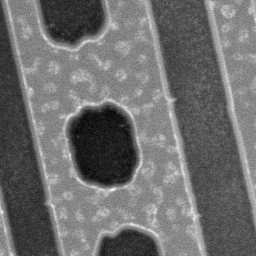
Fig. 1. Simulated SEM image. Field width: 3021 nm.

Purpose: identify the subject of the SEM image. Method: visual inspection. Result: one or a few lines or trenches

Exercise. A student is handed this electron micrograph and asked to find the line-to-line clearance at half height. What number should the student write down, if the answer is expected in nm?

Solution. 707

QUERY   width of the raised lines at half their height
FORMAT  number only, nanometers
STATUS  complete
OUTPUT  486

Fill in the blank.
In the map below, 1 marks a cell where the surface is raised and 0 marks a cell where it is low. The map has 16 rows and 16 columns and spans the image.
1100000110000111
0110000110000111
0110011111000011
0111111111000011
0111111111000011
0011111111000011
0011111111100011
0011000011100001
0011000011100001
0011000001100001
0001100001110001
0001110011110000
0001111111110000
0001111111110000
0000111001110000
1000110000111000